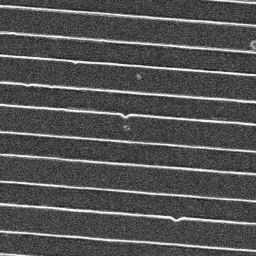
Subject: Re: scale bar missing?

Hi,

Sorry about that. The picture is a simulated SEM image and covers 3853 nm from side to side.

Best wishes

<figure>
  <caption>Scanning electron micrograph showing parallel lines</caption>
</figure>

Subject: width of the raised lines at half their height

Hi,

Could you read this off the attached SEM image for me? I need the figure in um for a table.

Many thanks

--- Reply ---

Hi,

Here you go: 0.413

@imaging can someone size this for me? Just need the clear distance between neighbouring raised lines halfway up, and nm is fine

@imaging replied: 334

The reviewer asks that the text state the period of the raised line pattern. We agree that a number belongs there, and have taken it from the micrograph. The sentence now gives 744 nm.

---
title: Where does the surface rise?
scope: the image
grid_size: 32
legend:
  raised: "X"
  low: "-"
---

--------------------------------
XXXXXXXXXX----------------------
XXXXXXXXXXXXXXXXXXXXXXX---------
XXXXXXXXXXXXXXXXXXXXXXXXXXXXXXXX
-----XXXXXXXXXXXXXXXXXXXXXXXXXXX
------------------XXXXXXXXXXXXXX
-------------------------------X
XXXXXXX-------------------------
XXXXXXXXXXXXXXXXXXXX------------
XXXXXXXXXXXXXXXXXXXXXXXXXXXXXXXX
--XXXXXXXXXXXXXXXXXXXXXXXXXXXXXX
---------------XXXXXXXXXXXXXXXXX
-----------------------------XXX
XXXX-X--------------------------
XXXXXXXXXXXXXXXXXXX-------------
XXXXXXXXXXXXXXXXXXXXXXXXXXXXXXX-
-XXXXXXXXXXXXXXXXXXXXXXXXXXXXXXX
--------------XXXXXXXXXXXXXXXXXX
--------------------------XXXXXX
XXX-----------------------------
XXXXXXXXXXXXXX------------------
XXXXXXXXXXXXXXXXXXXXXXXXXXX-----
XXXXXXXXXXXXXXXXXXXXXXXXXXXXXXXX
-----------XXXXXXXXXXXXXXXXXXXXX
------------------------XXXXXXXX
--------------------------------
XXXXXXXXXXXX--------------------
XXXXXXXXXXXXXXXXXXXXXXXXXX------
XXXXXXXXXXXXXXXXXXXXXXXXXXXXXXXX
--------XXXXXXXXXXXXXXXXXXXXXXXX
---------------------XXXXXXXXXXX
--------------------------------